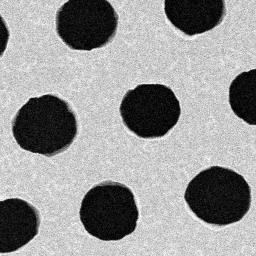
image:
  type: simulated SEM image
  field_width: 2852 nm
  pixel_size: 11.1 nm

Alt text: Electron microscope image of holes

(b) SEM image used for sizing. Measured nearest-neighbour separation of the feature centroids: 1190 nanometres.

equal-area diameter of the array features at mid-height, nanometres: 671